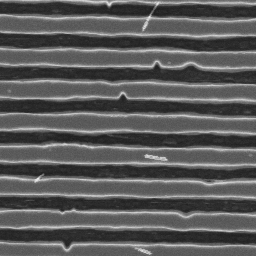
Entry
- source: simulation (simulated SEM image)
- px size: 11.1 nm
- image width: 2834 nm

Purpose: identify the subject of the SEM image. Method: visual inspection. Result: parallel lines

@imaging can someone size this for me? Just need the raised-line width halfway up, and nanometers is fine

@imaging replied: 201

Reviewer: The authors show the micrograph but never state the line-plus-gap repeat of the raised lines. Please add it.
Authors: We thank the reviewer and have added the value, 358 nanometres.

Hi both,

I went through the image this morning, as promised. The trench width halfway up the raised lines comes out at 162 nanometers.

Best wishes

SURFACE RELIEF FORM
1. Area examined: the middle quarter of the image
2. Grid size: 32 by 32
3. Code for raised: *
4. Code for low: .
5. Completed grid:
***********************.******..
................................
................................
................................
***********....*.******.........
********************************
********************************
********************************
*******.....**..****************
................................
................................
................................
*********...***..**.............
********************************
********************************
********************************
********************************
................................
................................
................................
******..........................
********************************
********************************
********************************
********************************
...............................*
................................
................................
*.*.............................
********************************
********************************
********************************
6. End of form